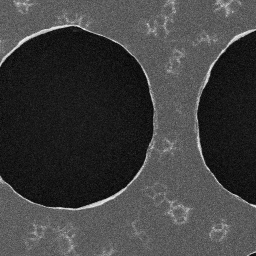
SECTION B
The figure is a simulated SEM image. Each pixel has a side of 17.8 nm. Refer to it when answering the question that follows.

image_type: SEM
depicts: holes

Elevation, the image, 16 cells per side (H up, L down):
HHHHHHHHHHHHHHHH
HHHHHHHHHHHHHHHH
HHLLLLLHHHHHHHHL
HLLLLLLLHHHHHHLL
LLLLLLLLLHHHHLLL
LLLLLLLLLHHHHLLL
LLLLLLLLLLHHLLLL
LLLLLLLLLLHHLLLL
LLLLLLLLLLHHLLLL
LLLLLLLLLHHHHLLL
LLLLLLLLLHHHHLLL
LLLLLLLLHHHHHHLL
HHLLLLHHHHHHHHHL
HHHHHHHHHHHHHHHH
HHHHHHHHHHHHHHHH
HHHHHHHHHHHHHHHH